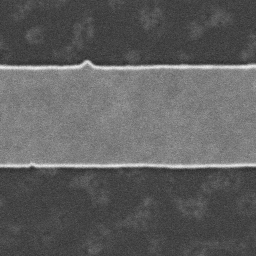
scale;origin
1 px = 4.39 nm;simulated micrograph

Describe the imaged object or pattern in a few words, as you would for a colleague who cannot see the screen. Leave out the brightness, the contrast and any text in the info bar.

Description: one or a few lines or trenches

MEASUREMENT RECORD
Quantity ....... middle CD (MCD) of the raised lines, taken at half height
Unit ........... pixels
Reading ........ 99.1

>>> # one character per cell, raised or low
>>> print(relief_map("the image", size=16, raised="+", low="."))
................
................
................
................
++++++++++++++++
++++++++++++++++
++++++++++++++++
++++++++++++++++
++++++++++++++++
++++++++++++++++
................
................
................
................
................
................